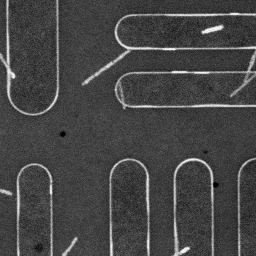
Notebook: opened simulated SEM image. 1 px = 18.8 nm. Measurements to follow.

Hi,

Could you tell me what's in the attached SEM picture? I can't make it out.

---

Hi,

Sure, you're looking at groups of lines, slits or small figures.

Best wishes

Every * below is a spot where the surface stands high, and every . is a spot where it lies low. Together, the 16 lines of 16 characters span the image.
****............
****...*********
.***...*********
.***............
.***...........*
.***...*********
.**.....********
................
................
................
..*....**..**..*
.**....**..**..*
.**....**..**..*
.**....**..**..*
.**....**..**..*
.**....**..**..*